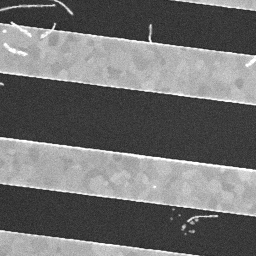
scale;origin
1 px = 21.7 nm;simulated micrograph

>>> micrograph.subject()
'lines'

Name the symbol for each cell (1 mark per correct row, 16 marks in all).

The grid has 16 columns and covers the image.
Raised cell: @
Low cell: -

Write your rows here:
---------------@
@---------------
@@@@@@@@--------
@@@@@@@@@@@@@@@@
@@@@@@@@@@@@@@@@
--------@@@@@@@@
----------------
----------------
----------------
@@@@@@@---------
@@@@@@@@@@@@@@@-
@@@@@@@@@@@@@@@@
--------@@@@@@@@
----------------
@---------------
@@@@@@@@@-------